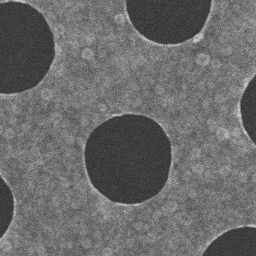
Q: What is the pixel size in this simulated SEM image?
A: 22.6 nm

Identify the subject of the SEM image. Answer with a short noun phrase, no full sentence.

holes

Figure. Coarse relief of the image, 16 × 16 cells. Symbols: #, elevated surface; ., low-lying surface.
..######.....###
...#####.....###
...######...####
...#############
...#############
..#############.
###############.
#######...#####.
######....######
#####......#####
#####......#####
######....######
.######..#######
.###############
##############..
#############...